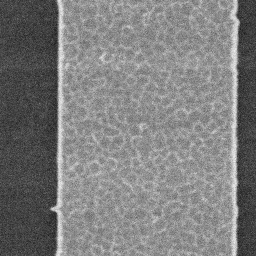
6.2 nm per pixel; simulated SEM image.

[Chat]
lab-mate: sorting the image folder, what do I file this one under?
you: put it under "one or a few lines or trenches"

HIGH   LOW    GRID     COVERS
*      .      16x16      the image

....***********.
....***********.
....***********.
....***********.
....***********.
....***********.
....***********.
....***********.
....***********.
....***********.
....***********.
....***********.
....***********.
....***********.
....***********.
....***********.